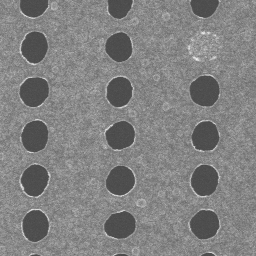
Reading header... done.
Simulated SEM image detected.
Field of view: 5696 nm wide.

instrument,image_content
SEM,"a regular array of holes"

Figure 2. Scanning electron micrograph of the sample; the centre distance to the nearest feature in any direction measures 987 nm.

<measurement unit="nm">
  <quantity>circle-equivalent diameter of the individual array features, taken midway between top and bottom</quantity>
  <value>653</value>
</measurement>